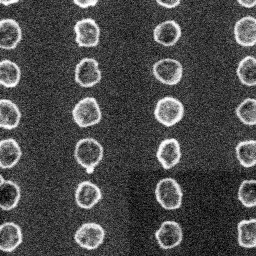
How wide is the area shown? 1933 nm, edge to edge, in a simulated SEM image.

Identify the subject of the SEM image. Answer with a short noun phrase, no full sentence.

a regular array of raised bodies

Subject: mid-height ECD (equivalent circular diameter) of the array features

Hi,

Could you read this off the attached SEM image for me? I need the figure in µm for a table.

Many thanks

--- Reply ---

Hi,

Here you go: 0.193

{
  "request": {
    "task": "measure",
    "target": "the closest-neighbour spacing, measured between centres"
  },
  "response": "303 nm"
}